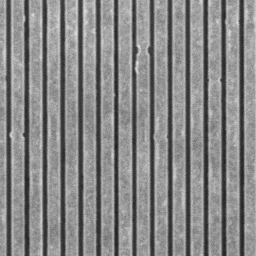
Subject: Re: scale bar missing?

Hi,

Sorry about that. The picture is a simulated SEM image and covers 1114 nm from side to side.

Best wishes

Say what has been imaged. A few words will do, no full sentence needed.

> parallel lines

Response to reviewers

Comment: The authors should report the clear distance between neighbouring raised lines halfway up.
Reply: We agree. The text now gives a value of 23.4 nm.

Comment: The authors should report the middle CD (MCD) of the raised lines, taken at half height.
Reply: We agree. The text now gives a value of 12.5 px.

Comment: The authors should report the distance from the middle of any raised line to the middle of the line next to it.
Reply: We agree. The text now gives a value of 77.9 nm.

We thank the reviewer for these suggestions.